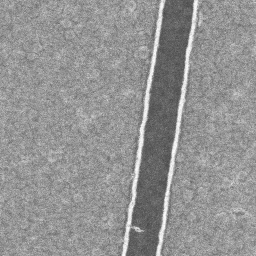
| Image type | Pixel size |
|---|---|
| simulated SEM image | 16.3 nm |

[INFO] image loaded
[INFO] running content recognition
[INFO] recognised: one or a few lines or trenches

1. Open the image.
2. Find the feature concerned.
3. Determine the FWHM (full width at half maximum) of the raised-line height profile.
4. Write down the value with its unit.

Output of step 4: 553 nm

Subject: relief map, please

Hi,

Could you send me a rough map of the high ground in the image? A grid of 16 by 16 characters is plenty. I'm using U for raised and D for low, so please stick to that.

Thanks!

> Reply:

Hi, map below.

DDDDDDDDDDUUDDDD
DDDDDDDDDDUUDDDD
DDDDDDDDDDUUDDDD
DDDDDDDDDDUUDDDD
DDDDDDDDDUUUDDDD
DDDDDDDDDUUUDDDD
DDDDDDDDDUUDDDDD
DDDDDDDDDUUDDDDD
DDDDDDDDDUUDDDDD
DDDDDDDDDUUDDDDD
DDDDDDDDDUUDDDDD
DDDDDDDDUUUDDDDD
DDDDDDDDUUDDDDDD
DDDDDDDDUUDDDDDD
DDDDDDDDUUDDDDDD
DDDDDDDDUUDDDDDD